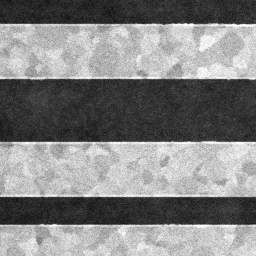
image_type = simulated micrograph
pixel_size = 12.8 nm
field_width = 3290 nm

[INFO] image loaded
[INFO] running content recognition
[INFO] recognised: lines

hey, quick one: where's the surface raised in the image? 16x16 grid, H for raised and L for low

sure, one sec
LLLLLLLLLLLLLLLL
LLLLLLLLLLLLLLLL
HHHHHHHHHHHHHHHH
HHHHHHHHHHHHHHHH
HHHHHHHHHHHHHHHH
LLLLLLLLLLLLLLLL
LLLLLLLLLLLLLLLL
LLLLLLLLLLLLLLLL
LLLLLLLLLLLLLLLL
HHHHHHHHHHHHHHHH
HHHHHHHHHHHHHHHH
HHHHHHHHHHHHHHHH
LLLLLLLLLLLLLLLL
LLLLLLLLLLLLLLLL
HHHHHHHHHHHHHHHH
HHHHHHHHHHHHHHHH